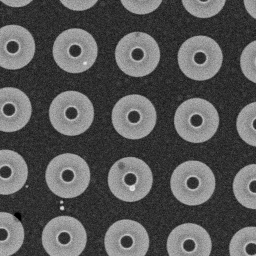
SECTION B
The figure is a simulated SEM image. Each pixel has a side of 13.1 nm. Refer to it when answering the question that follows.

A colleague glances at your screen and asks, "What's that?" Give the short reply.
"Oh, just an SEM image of an array of small figures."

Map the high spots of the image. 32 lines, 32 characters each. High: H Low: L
LHHLLLLLHHHHLLLHHHHHLLLHHHHHLLLH
LLLLLLLLLLLLLLLLHHHLLLLLHHHLLLLH
LLLLLLLLLLLLLLLLLLLLLLLLLLLLLLLL
HHHLLLLLLLLLLLLLLLLLLLLLLLLLLLLL
HHHHLLLHHHHLLLLLHHHLLLLLLHLLLLLL
HHHHLLLHHHHHLLLHHHHHLLLHHHHLLLLH
HHHHLLLHHHHHLLHHHHHHLLHHHHHHLLHH
HHHHLLLHHHHHLLHHHHHHLLHHHHHHLLHH
LHHLLLLLHHHLLLLHHHHLLLLHHHHLLLHH
LLLLLLLLLLLLLLLLHHLLLLLHHHHLLLLH
LLLLLLLLLLLLLLLLLLLLLLLLLLLLLLLL
HHHLLLLLHHLLLLLLLLLLLLLLLLLLLLLL
HHHHLLLHHHHLLLLHHHHLLLLHHHLLLLLL
HHHHLLHHHHHHLLHHHHHLLLHHHHHLLLHH
HHHHLLHHHHHHLLHHHHHLLLHHHHHLLLHH
HHHLLLHHHHHLLLHHHHHLLLHHHHHLLLHH
LLLLLLLHHHLLLLLHHHHLLLHHHHHLLLHH
LLLLLLLLLLLLLLLLLLLLLLLHHHLLLLHH
LLLLLLLLLLLLLLLLLLLLLLLLLLLLLLLL
HHHLLLLHHHLLLLLLLLLLLLLLLLLLLLLL
HHHLLLHHHHHLLLHHHHLLLLLHHHLLLLLL
HHHLLLHHHHHLLLHHHHHLLLHHHHHLLLHH
HHHLLLHHHHHLLLHHHHHLLHHHHHHLLHHH
HHHLLLHHHHHLLLHHHHHLLHHHHHHLLHHH
LLLLLLLHHHLLLLHHHHLLLLHHHHLLLHHH
LLLLLLLLLLLLLLLLLLLLLLLHHLLLLLHH
LLLLLLLLLLLLLLLLLLLLLLLLLLLLLLLL
HHLLLLHHHHLLLLLHLLLLLLLLLLLLLLLL
HHHLLLHHHHLLLLHHHHLLLLHHHLLLLLLH
HHHLLHHHHHHLLHHHHHHLLHHHHHLLLHHH
HHHLLHHHHHHLLHHHHHHLLHHHHHLLLHHH
HHLLLLHHHHLLLHHHHHLLLHHHHHLLLHHH